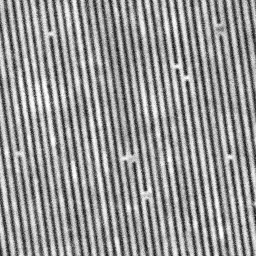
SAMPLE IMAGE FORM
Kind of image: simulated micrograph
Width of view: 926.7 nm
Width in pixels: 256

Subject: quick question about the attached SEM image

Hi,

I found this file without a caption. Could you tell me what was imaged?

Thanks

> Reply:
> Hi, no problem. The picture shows parallel lines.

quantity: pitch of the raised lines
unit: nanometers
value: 29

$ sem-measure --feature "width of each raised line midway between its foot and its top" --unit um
0.0139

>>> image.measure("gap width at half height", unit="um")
0.0139